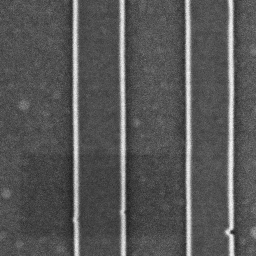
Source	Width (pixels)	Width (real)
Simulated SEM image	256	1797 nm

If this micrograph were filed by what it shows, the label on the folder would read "one or a few lines or trenches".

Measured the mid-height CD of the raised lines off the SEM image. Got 0.317 microns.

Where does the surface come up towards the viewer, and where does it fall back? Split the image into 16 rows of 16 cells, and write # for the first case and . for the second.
.....###....##..
.....###....##..
.....###....##..
.....###....##..
.....###....##..
.....###....##..
.....###....##..
.....###....##..
.....###....##..
.....###....##..
.....###....##..
.....###....##..
.....###....##..
.....###....##..
.....###....##..
.....###....###.